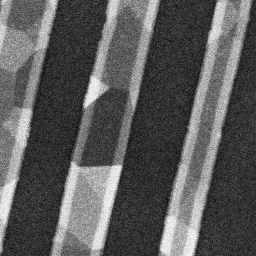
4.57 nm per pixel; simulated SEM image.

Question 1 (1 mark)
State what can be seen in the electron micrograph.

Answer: one or a few lines or trenches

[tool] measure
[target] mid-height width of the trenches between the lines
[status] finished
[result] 294 nanometers